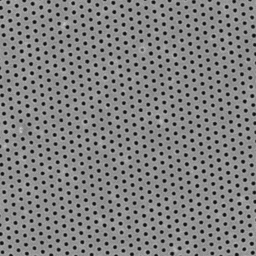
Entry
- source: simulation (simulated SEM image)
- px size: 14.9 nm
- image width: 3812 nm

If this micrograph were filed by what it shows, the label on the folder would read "a regular array of holes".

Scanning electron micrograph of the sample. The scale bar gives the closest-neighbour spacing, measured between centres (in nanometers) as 134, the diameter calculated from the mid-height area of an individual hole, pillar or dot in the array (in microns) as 0.0629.